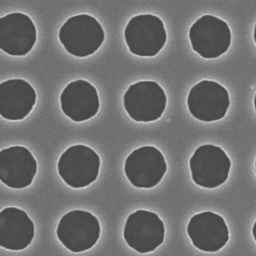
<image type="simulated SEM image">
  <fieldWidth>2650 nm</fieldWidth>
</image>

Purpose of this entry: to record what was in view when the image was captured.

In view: a regular array of holes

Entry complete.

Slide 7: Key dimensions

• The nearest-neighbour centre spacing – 664 nm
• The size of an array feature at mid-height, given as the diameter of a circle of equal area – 41.7 px